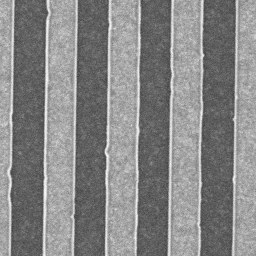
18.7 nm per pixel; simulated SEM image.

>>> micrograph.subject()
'one or a few lines or trenches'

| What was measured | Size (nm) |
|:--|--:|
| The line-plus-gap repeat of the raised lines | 1170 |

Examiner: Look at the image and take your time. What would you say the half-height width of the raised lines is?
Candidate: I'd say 559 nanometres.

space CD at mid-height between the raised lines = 624 nanometres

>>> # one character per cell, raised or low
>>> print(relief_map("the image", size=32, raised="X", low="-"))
XX----XXXX----XXX-----XXX-----XX
XX----XXXX----XXX-----XXX-----XX
XX----XXXX----XXX-----XXX-----XX
XX----XXXX----XXX-----XXX-----XX
XX----XXXX----XXX-----XXX-----XX
XX----XXX-----XXX-----XXX-----XX
XX----XXX-----XXX----XXXX-----XX
XX----XXX-----XXX-----XXX-----XX
XX----XXX-----XXX-----XXX-----XX
XX----XXX-----XXX-----XXX-----XX
X-----XXX-----XXX-----XXX-----XX
X-----XXX-----XXX-----XXX-----XX
X-----XXX-----XXX----XXXX-----XX
X-----XXX-----XXX----XXXX----XXX
X-----XXX-----XXX----XXXX----XXX
X-----XXX-----XXX----XXXX----XXX
X-----XXX-----XXX----XXXX----XXX
X-----XXX-----XXX----XXXX----XXX
X-----XXX----XXXX----XXXX----XXX
X-----XXX----XXXX----XXXX----XXX
X-----XXX----XXXX----XXXX----XXX
X-----XXX----XXXX----XXXX----XXX
X-----XXX----XXXX----XXXX----XXX
X-----XXX----XXXX----XXXX----XXX
X-----XXX----XXXX----XXXX----XXX
X-----XXX----XXXX----XXXX----XXX
X-----XXX----XXXX----XXXX----XXX
X-----XXX----XXXX----XXXX----XXX
X-----XXX----XXXX----XXXX----XXX
X-----XXX----XXXX----XXXX----XXX
X-----XXX----XXXX----XXXX----XXX
X-----XXX----XXXX----XXXX----XXX